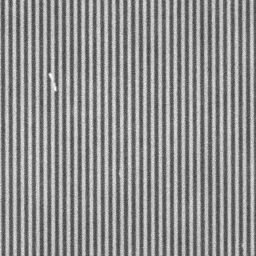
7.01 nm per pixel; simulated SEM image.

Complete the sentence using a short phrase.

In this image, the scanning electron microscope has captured parallel lines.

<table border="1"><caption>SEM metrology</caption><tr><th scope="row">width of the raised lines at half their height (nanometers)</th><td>18.4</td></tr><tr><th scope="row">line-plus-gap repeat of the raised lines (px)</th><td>7.65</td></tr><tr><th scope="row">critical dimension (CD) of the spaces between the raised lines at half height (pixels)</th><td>4.49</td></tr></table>